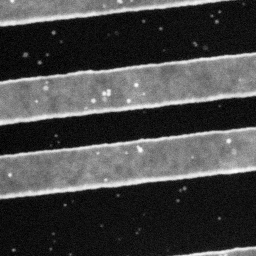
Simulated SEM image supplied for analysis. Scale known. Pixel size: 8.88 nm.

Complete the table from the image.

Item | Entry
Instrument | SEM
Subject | lines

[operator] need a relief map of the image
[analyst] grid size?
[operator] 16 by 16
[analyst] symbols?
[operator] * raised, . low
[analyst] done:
**********......
*...............
................
..............**
.....***********
****************
***********.....
**..............
...........*****
..**************
****************
********........
................
................
................
...............*